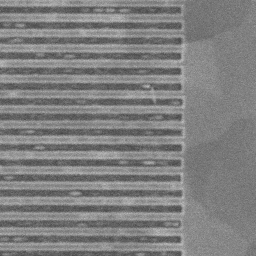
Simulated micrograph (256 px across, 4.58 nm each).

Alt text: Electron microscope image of parallel lines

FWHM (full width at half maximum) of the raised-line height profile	0.0269	microns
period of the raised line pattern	69.8	nanometres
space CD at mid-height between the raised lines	41.8	nanometers